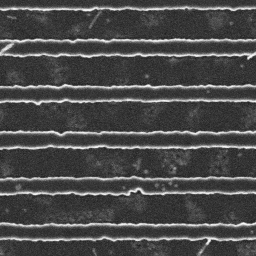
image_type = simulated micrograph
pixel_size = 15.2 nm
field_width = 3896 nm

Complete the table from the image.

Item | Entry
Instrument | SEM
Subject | parallel lines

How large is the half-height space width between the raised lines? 457 nanometres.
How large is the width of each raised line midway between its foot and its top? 236 nanometres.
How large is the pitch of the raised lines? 0.701 um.